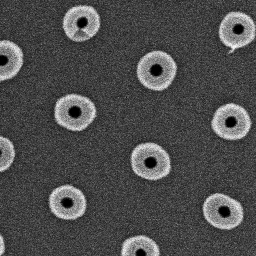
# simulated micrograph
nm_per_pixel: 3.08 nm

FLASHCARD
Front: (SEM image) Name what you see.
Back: a regular array of ring-shaped raised bodies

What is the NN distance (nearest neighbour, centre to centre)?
0.276 micrometres